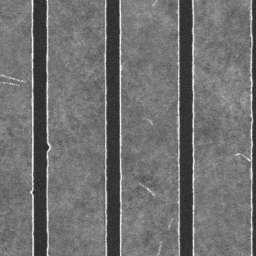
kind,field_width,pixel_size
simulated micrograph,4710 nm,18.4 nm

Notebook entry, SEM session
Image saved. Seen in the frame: one or a few lines or trenches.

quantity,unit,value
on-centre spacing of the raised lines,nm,1340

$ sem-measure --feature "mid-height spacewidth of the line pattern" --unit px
57.9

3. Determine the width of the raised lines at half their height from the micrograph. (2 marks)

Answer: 283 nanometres